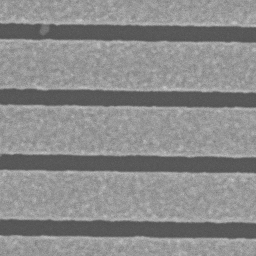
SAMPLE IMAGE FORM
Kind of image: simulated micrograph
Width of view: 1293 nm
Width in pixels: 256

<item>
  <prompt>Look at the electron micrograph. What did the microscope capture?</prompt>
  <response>lines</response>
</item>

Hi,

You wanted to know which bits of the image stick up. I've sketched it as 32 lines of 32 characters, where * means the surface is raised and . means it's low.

********************************
********************************
********************************
................................
................................
********************************
********************************
********************************
********************************
********************************
********************************
.............................***
................................
**************************..***.
********************************
********************************
********************************
********************************
********************************
.......................**..*****
................................
***************.................
********************************
********************************
********************************
********************************
********************************
.....***************************
................................
***..*..........................
********************************
********************************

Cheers